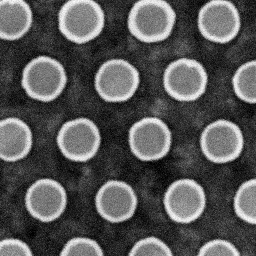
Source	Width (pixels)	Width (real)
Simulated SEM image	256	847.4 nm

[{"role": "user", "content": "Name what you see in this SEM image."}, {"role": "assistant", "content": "a regular array of raised bodies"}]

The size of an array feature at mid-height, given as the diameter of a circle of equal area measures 129 nm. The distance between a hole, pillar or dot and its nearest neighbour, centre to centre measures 228 nm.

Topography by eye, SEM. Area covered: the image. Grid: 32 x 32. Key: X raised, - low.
XXX------XXX-----XXX------XX----
XXXX----XXXXX----XXXX----XXXX---
XXXX----XXXXX---XXXXX----XXXXX--
XXX-----XXXX-----XXXX----XXXXX--
XX-------XXX------XX------XXX---
--------------------------------
--------------------------------
-----X--------------------------
---XXXXX-----XXX-----XXXX-----XX
---XXXXX----XXXXX----XXXX----XXX
---XXXXX----XXXXX----XXXX----XXX
----XXX-----XXXXX----XXXX-----XX
-------------------------------X
--------------------------------
--------------------------------
XXX------XX------XXX-------XX---
XXXX----XXXX----XXXXX-----XXXX--
XXXX---XXXXX----XXXXX----XXXXX--
XXXX----XXXX-----XXXX----XXXXX--
XXX------XX------XXX------XXX---
--------------------------------
--------------------------------
--------------------------------
----XXXX-----XXX-----XXXX-----XX
----XXXX----XXXXX----XXXX-----XX
----XXXX----XXXXX----XXXX-----XX
----XXXX-----XXX-----XXXX-----XX
--------------X-------XX-------X
--------------------------------
--------------------------------
XXX------XXX-----XXX------XX----
XXXX----XXXX-----XXXX----XXXX---